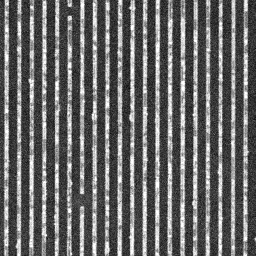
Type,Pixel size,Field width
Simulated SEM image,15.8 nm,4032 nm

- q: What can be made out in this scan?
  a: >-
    parallel lines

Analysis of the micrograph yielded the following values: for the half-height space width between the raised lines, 148 nanometers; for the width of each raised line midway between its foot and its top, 2.88 px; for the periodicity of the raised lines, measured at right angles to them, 0.198 micrometres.